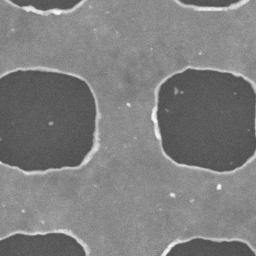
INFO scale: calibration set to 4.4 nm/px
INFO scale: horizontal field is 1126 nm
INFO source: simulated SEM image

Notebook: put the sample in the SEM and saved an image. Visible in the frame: holes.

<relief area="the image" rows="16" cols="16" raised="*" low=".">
**...***********
****************
****************
****************
*...*******...**
......****......
......****......
......****......
......****......
......****......
*...*********..*
****************
****************
****************
****************
.....******.....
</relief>